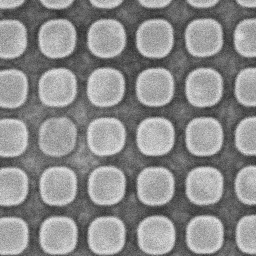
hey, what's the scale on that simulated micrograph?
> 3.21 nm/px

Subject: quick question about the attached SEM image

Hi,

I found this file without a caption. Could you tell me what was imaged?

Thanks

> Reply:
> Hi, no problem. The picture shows a regular array of raised bodies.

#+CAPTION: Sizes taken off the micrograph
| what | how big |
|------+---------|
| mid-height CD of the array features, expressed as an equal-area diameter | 126 nm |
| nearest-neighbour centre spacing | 156 nm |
